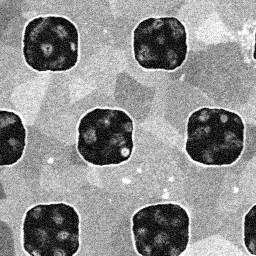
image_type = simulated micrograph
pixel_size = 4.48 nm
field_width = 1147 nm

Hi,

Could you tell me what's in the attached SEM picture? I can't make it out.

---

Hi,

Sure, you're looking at holes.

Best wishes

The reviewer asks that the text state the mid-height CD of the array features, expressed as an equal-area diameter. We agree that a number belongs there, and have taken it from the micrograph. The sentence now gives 266 nm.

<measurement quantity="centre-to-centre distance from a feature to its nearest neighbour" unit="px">108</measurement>